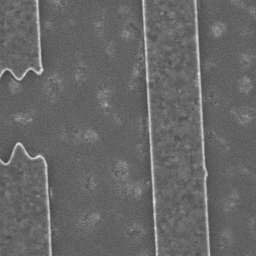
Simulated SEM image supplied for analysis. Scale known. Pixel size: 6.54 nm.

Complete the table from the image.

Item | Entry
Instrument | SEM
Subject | one or a few lines or trenches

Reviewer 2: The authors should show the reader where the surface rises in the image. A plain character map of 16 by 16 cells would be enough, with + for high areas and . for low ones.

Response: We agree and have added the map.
++.......+++....
++.......+++....
++.......+++....
+++......+++....
++.......+++....
.........++++...
.........++++...
.........++++...
.........++++...
.+.......++++...
+++.......+++...
+++.......+++...
+++.......+++...
+++.......+++...
+++.......+++...
+++.......+++...